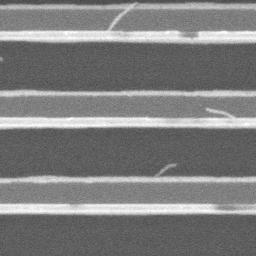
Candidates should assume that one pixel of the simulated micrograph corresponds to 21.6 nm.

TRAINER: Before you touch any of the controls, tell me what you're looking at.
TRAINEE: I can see lines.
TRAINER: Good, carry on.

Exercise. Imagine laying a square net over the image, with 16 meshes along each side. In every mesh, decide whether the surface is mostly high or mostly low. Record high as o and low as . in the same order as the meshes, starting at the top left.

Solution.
oooooooooooooooo
oooooooooooooooo
................
................
................
................
oooooooooooooooo
oooooooooooooooo
................
................
................
oooooooooooooooo
oooooooooooooooo
................
................
................